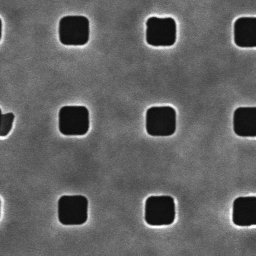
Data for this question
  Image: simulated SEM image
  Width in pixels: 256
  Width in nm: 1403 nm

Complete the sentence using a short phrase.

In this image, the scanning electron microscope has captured holes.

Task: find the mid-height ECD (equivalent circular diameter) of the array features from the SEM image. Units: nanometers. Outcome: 177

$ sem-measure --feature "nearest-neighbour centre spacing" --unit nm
478